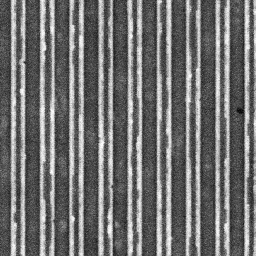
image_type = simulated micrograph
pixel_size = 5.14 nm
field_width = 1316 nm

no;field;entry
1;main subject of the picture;parallel lines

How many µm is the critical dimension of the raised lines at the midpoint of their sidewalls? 0.0649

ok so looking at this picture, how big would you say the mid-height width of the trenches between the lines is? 86.7 nanometers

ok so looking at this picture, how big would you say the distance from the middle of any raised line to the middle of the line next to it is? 150 nanometers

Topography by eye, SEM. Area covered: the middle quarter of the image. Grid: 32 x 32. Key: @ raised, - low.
--@@-----@@@-----@@-----@@-----@
--@@-----@@@-----@@-----@@-----@
--@@-----@@@-----@@-----@@-----@
--@@-----@@@----@@@-----@@-----@
--@@-----@@@----@@@-----@@-----@
--@@-----@@@----@@@-----@@-----@
--@@-----@@@----@@@-----@@-----@
--@@-----@@@----@@@-----@@-----@
--@@-----@@@----@@@-----@@-----@
--@@-----@@@----@@@-----@@-----@
--@@-----@@@----@@@-----@@-----@
--@@-----@@@----@@@-----@@-----@
--@@-----@@@----@@@-----@@-----@
--@@-----@@@----@@@-----@@-----@
--@@-----@@@----@@@-----@@-----@
--@@-----@@@----@@@-----@@-----@
--@@-----@@@----@@@-----@@-----@
--@@-----@@@----@@@-----@@-----@
--@@-----@@@----@@@-----@@-----@
--@@-----@@@----@@@-----@@-----@
--@@-----@@@----@@@-----@@-----@
--@@-----@@@----@@@-----@@-----@
--@@-----@@@----@@@-----@@-----@
--@@-----@@@----@@@-----@@-----@
--@@-----@@@----@@@-----@@-----@
--@@-----@@@----@@@-----@@-----@
--@@-----@@@----@@@-----@@-----@
--@@-----@@@----@@@-----@@-----@
--@@-----@@@----@@@-----@@-----@
--@@-----@@@----@@@-----@@-----@
--@@-----@@@----@@@-----@@-----@
--@@-----@@@----@@@-----@@-----@